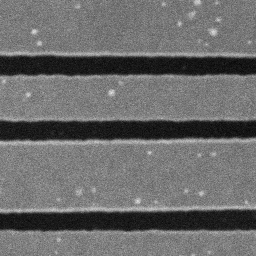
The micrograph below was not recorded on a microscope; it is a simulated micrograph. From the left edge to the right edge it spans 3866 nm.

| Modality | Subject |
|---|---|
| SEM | lines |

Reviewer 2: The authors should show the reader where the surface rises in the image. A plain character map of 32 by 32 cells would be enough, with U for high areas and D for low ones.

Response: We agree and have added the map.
UUUUUUUUUUUUUUUUUUUUUUUUUUUUUUUU
UUUUUUUUUUUUUUUUUUUUUUUUUUUUUUUU
UUUUUUUUUUUUUUUUUUUUUUUUUUUUUUUU
UUUUUUUUUUUUUUUUUUUUUUUUUUUUUUUU
UUUUUUUUUUUUUUUUUUUUUUUUUUUUUUUU
UUUUUUUUUUUUUUUUUUUUUUUUUUUUUUUU
UUUUUUUUUUUUUUUUUUUUUUUUUUUUUUUU
DDDDDDDDDDDDDDDDDDDDDDDDDDDDDDDD
DDDDDDDDDDDDDDDDDDDDDDDDDDDDDDDD
DDUDUUUUDUDUUUUUUUUUUUUUDUUUUUUU
UUUUUUUUUUUUUUUUUUUUUUUUUUUUUUUU
UUUUUUUUUUUUUUUUUUUUUUUUUUUUUUUU
UUUUUUUUUUUUUUUUUUUUUUUUUUUUUUUU
UUUUUUUUUUUUUUUUUUUUUUUUUUUUUUUU
UUUUUUUUUUUUUUUUUUUUUUUUUUUUUUUU
DDDDDDDDDDDDDDDDDDDDDDDDDDDDDDDD
DDDDDDDDDDDDDDDDDDDDDDDDDDDDDDDD
DDDDDDDDDDDDDDUDUUDUUUUUUUUUUUUU
UUUUUUUUUUUUUUUUUUUUUUUUUUUUUUUU
UUUUUUUUUUUUUUUUUUUUUUUUUUUUUUUU
UUUUUUUUUUUUUUUUUUUUUUUUUUUUUUUU
UUUUUUUUUUUUUUUUUUUUUUUUUUUUUUUU
UUUUUUUUUUUUUUUUUUUUUUUUUUUUUUUU
UUUUUUUUUUUUUUUUUUUUUUUUUUUUUUUU
UUUUUUUUUUUUUUUUUUUUUUUUUUUUUUUU
UUUUUUUUUUUUUUUUUUUUUUUUUUUUUUUU
UUUUUUUUUDDDDDDUDDDDDDDDDDDDDDDD
DDDDDDDDDDDDDDDDDDDDDDDDDDDDDDDD
DDDDDDDDDDDDDDDDDDDDDDDDDDDDDDDD
UUUUUUUUUUUUUUUUUUUUUUUUUUUUUUUU
UUUUUUUUUUUUUUUUUUUUUUUUUUUUUUUU
UUUUUUUUUUUUUUUUUUUUUUUUUUUUUUUU